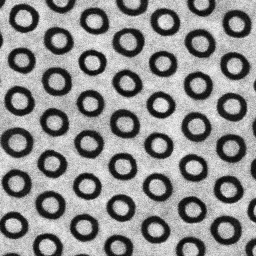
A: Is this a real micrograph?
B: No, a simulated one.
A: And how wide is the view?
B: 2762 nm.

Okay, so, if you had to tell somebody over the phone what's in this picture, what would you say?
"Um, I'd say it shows a regular array of ring-shaped grooves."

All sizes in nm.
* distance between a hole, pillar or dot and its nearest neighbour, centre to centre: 436